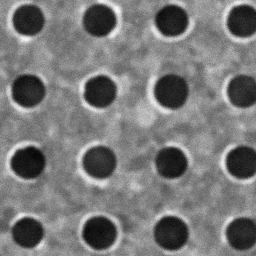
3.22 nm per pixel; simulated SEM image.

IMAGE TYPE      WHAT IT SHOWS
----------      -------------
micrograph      a regular array of holes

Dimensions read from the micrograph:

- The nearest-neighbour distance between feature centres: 227 nm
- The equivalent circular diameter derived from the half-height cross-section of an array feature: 113 nm